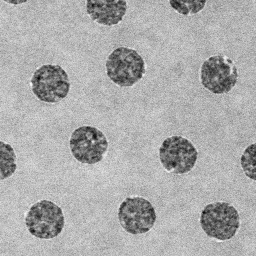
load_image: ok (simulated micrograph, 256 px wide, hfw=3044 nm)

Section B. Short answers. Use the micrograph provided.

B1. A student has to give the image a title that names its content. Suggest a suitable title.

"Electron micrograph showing a regular array of raised bodies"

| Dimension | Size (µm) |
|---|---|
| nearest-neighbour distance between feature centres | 0.895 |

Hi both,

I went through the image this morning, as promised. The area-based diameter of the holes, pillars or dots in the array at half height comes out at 461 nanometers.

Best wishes